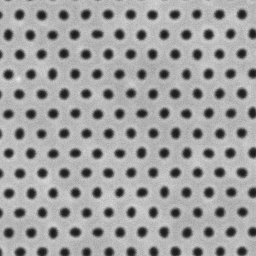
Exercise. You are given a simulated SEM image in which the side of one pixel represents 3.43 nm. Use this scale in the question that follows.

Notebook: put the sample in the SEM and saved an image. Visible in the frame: a regular array of holes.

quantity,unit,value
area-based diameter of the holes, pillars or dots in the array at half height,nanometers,37.5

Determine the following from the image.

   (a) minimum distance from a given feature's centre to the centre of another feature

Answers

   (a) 75.4 nm